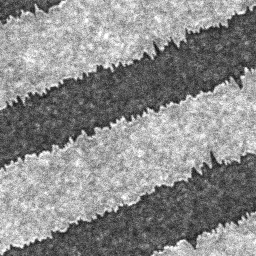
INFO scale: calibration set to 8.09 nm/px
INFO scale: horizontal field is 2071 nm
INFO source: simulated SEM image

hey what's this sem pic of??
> one or a few lines or trenches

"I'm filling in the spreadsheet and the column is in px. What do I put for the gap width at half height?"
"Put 58.6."